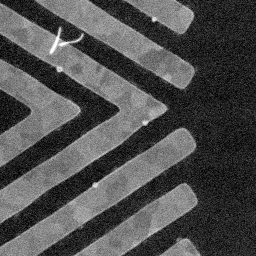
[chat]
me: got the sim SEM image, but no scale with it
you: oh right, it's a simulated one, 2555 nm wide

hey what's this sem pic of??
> groups of lines, slits or small figures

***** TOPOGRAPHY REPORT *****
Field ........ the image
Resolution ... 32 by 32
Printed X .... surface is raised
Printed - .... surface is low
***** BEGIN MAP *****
-----XXXXXXX----XXXXXXX---------
XX-----XXXXXX-----XXXXXX--------
XXX-----XXXXXXX----XXXXX--------
XXXXX-----XXXXXX-----XX---------
-XXXXXX-----XXXXXX--------------
--XXXXXXX----XXXXXX-------------
----XXXXXX-----XXXXXX-----------
-----XXXXXXX-----XXXXXX---------
XX-----XXXXXX-----XXXXXX--------
XXXX-----XXXXXX-----XXXX--------
XXXXX-----XXXXXX------X---------
-XXXXXX-----XXXXXX--------------
--XXXXXX-----XXXXXXX------------
----XXXXXX-----XXXXXX-----------
----XXXXX-----XXXXXX------------
--XXXXXX-----XXXXX--------------
-XXXXX-----XXXXXX-----X---------
XXXXX-----XXXXXX----XXXX--------
XXX-----XXXXXX-----XXXXX--------
XX-----XXXXXX----XXXXXX---------
X----XXXXXX-----XXXXXX----------
----XXXXXX----XXXXXX------------
--XXXXXX-----XXXXXX-------------
-XXXXX-----XXXXXX-----XX--------
XXXXX-----XXXXXX----XXXX--------
XXXX----XXXXXX-----XXXXX--------
XX-----XXXXXX----XXXXXX---------
X----XXXXXX-----XXXXXX----------
----XXXXXX----XXXXXX------------
--XXXXXX-----XXXXXX-------------
-XXXXXX----XXXXXX-----XX--------
XXXXX-----XXXXXX-----XXXX-------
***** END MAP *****